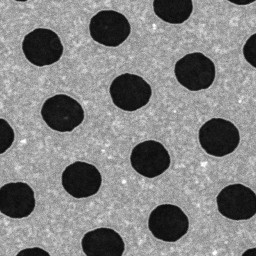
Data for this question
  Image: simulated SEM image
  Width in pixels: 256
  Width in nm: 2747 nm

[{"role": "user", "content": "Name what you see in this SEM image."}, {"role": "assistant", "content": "a regular array of holes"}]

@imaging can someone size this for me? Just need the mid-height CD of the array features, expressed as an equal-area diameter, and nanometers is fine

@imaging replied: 425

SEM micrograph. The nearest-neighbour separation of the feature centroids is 733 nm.